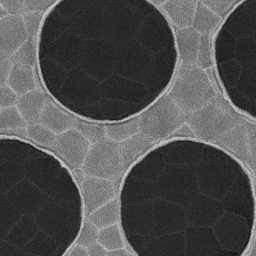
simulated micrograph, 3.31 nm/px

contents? holes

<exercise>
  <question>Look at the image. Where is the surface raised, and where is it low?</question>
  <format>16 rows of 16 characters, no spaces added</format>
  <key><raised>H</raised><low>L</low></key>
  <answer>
HHHLLLLLLLHHHHHL
HHHLLLLLLLLHHHLL
HHLLLLLLLLLHHLLL
HHLLLLLLLLLHHLLL
HHHLLLLLLLLHHHLL
HHHLLLLLLLHHHHLL
HHHHLLLLLHHHHHHL
HHHHHHLHHHHHHHHH
HHHHHHHHHHHHHHHH
LLLHHHHHHLLLLLHH
LLLLHHHHLLLLLLLH
LLLLLHHHLLLLLLLL
LLLLLHHHLLLLLLLL
LLLLLHHHLLLLLLLL
LLLLLHHHLLLLLLLL
LLLLHHHHLLLLLLLH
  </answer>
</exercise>